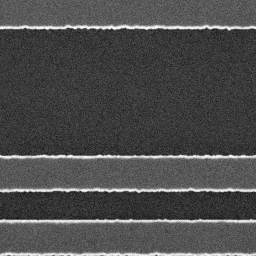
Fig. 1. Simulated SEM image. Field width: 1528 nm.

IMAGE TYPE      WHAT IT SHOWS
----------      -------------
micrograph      lines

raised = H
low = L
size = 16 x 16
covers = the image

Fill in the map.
HHHHHHHHHHHHHHHH
HHHHHHHHHHHHHHHH
LLLLLLLLLLLLLLLL
LLLLLLLLLLLLLLLL
LLLLLLLLLLLLLLLL
LLLLLLLLLLLLLLLL
LLLLLLLLLLLLLLLL
LLLLLLLLLLLLLLLL
LLLLLLLLLLLLLLLL
LLLLLLLLLLLLLLLL
HHHHHHHHHHHHHHHH
HHHHHHHHHHHHHHHH
LLLLLLLLLLLLLLLL
LLLLLLLLLLLLLLLL
HHHHHHHHHHHHHHHH
HHHHHHHHHHHHHHHH